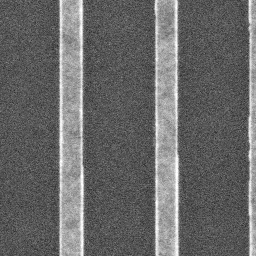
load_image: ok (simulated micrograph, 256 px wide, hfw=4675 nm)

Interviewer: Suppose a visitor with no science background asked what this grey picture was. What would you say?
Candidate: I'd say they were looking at lines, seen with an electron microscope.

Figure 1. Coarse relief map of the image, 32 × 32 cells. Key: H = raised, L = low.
LLLLLLLLHHLLLLLLLLLHHHLLLLLLLLLH
LLLLLLLLHHLLLLLLLLLHHHLLLLLLLLLH
LLLLLLLLHHLLLLLLLLLLHHLLLLLLLLLH
LLLLLLLLHHLLLLLLLLLLHHLLLLLLLLLH
LLLLLLLLHHLLLLLLLLLLHHLLLLLLLLLH
LLLLLLLLHHLLLLLLLLLLHHLLLLLLLLLH
LLLLLLLLHHLLLLLLLLLLHHLLLLLLLLLH
LLLLLLLLHHLLLLLLLLLLHHLLLLLLLLLH
LLLLLLLLHHLLLLLLLLLLHHLLLLLLLLLH
LLLLLLLLHHLLLLLLLLLLHHLLLLLLLLLH
LLLLLLLLHHLLLLLLLLLLHHLLLLLLLLLH
LLLLLLLLHHLLLLLLLLLLHHLLLLLLLLLH
LLLLLLLLHHLLLLLLLLLLHHLLLLLLLLLH
LLLLLLLLHHLLLLLLLLLLHHLLLLLLLLLH
LLLLLLLLHHLLLLLLLLLLHHLLLLLLLLLH
LLLLLLLLHHLLLLLLLLLLHHLLLLLLLLLH
LLLLLLLLHHLLLLLLLLLLHHLLLLLLLLLH
LLLLLLLLHHLLLLLLLLLLHHLLLLLLLLLH
LLLLLLLLHHLLLLLLLLLLHHLLLLLLLLLH
LLLLLLLLHHLLLLLLLLLLHHLLLLLLLLLH
LLLLLLLLHHLLLLLLLLLLHHLLLLLLLLLH
LLLLLLLLHHLLLLLLLLLLHHLLLLLLLLLH
LLLLLLLLHHLLLLLLLLLLHHLLLLLLLLLH
LLLLLLLLHHLLLLLLLLLLHHLLLLLLLLLH
LLLLLLLLHHLLLLLLLLLLHHLLLLLLLLLH
LLLLLLLLHHLLLLLLLLLLHHLLLLLLLLLH
LLLLLLLLHHLLLLLLLLLLHHLLLLLLLLLH
LLLLLLLLHHLLLLLLLLLLHHLLLLLLLLLH
LLLLLLLLHHLLLLLLLLLLHHLLLLLLLLLH
LLLLLLLLHHLLLLLLLLLLHHLLLLLLLLLH
LLLLLLLLHHLLLLLLLLLLHHLLLLLLLLLH
LLLLLLLLHHLLLLLLLLLLHHLLLLLLLLLH